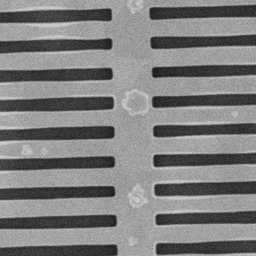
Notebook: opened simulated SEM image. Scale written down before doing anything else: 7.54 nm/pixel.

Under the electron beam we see groups of lines, slits or small figures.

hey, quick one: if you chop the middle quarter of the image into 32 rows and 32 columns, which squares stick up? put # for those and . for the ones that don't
#############################...
............##########..........
............##########..........
............###########.########
......##########################
################################
################################
################################
............##########..........
.............#########..........
.............#########..........
............####################
################################
################################
################################
###.........##########..........
.............#########..........
.............#########..........
............###########.....####
################################
################################
################################
#######################.........
.............#########..........
.............#########..........
.............#########..........
################################
################################
################################
##########################......
######......##########..........
.............#########..........